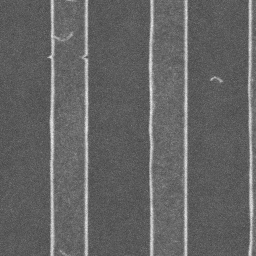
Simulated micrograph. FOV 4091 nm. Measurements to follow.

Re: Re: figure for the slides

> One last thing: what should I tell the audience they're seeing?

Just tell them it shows one or a few lines or trenches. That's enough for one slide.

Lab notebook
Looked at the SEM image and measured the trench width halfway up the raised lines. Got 1030 nm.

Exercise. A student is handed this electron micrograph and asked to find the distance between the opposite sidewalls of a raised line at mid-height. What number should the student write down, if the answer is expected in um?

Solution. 0.559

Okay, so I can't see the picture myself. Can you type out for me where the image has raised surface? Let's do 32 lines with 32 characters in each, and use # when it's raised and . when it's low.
.......####........####........#
.......####........####........#
.......####........####........#
.......####........####........#
.......####........####........#
.......####........####........#
.......####........####........#
......#####........####........#
.......####........####........#
.......####........####........#
.......####........####........#
.......####........####........#
.......####........####........#
.......####........####........#
.......####........####........#
.......####........####........#
.......####........####........#
.......####........####........#
.......####........####........#
.......####........####........#
.......####........####........#
.......####........####........#
.......####........####........#
.......####........####........#
.......####........####........#
.......####........####........#
.......####........####........#
.......####........####........#
.......####........####........#
.......####........####........#
.......####........####........#
.......####........####........#